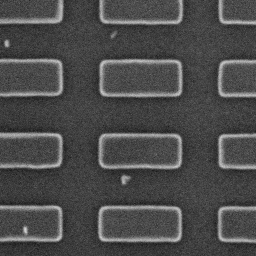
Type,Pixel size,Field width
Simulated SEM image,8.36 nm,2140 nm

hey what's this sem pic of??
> wiring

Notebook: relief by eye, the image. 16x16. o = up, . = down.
oooo..ooooo...oo
................
................
................
oooo..ooooo...oo
oooo..ooooo...oo
................
................
oooo...oooo...oo
oooo..ooooo...oo
................
................
................
oooo..ooooo...oo
oooo..ooooo...oo
................